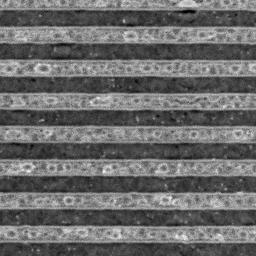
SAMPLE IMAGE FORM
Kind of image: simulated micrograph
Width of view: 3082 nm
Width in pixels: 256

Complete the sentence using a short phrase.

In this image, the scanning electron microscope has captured parallel lines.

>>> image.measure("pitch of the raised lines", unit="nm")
400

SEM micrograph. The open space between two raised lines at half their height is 214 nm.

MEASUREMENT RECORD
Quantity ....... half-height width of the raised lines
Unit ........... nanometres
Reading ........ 178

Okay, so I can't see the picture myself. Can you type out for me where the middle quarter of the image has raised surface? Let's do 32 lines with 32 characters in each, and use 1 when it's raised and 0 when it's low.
11111111111111111111111111111111
11111111111111111111111111111111
11111111111111111111111111111111
00000000000000000000000000000000
00000000000000000000000000000000
00000000000000000000000000000000
00000000000000000000000000000000
00000000000111100000000000000000
11111111111111111111111111111111
11111111111111111111111111111111
11111111111111111111111111111111
00000000000000000000000000000000
00000000000000000000000000000000
00000000000000000000000000000000
00000000000000000000000000000000
00000000000000000000000000000000
11111111111111111111111111111111
11111111111111111111111111111111
11111111111111111111111111111111
00000000001111110101111111111111
00000000000000000000000000000000
00000000000000000000000000000000
00000000000000000000000000000000
00000000000000000000000000000000
11111111111111111111111111111111
11111111111111111111111111111111
11111111111111111111111111111111
11111111111111111111111111111111
00000000000000000000000000000000
00000000000000000000000000000000
00000000000000000000000000000000
00000000000000000000000000000000